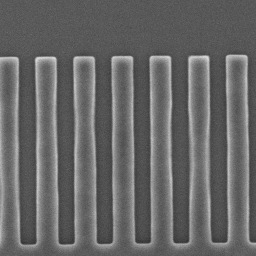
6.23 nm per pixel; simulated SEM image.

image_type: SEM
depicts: groups of lines, slits or small figures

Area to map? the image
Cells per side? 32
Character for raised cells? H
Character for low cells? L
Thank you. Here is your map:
LLLLLLLLLLLLLLLLLLLLLLLLLLLLLLLL
LLLLLLLLLLLLLLLLLLLLLLLLLLLLLLLL
LLLLLLLLLLLLLLLLLLLLLLLLLLLLLLLL
LLLLLLLLLLLLLLLLLLLLLLLLLLLLLLLL
LLLLLLLLLLLLLLLLLLLLLLLLLLLLLLLL
LLLLLLLLLLLLLLLLLLLLLLLLLLLLLLLL
LLLLLLLLLLLLLLLLLLLLLLLLLLLLLLLL
HHLLLHHLLHHHLLHHHLLHHLLLHHLLHHHL
HHLLLHHLLHHHLLHHHLLHHLLLHHLLHHHL
HHLLLHHLLHHHLLHHHLLHHLLLHHLLHHHL
HHLLLHHLLHHHLLHHHLLHHLLLHHLLHHHL
HHLLLHHLLHHHLLHHHLLHHLLLHHLLHHHL
HHLLLHHLLHHHLLHHHLLHHLLLHHLLHHHL
HHLLLHHLLHHHLLHHHLLHHLLLHHLLHHHL
HHLLLHHLLHHHLLHHHLLHHLLLHHLLHHHL
HHLLLHHLLHHHLLHHHLLHHLLLHHLLHHHL
HHLLLHHLLHHHLLHHHLLHHLLLHHLLHHHL
HHLLLHHLLHHHLLHHHLLHHLLLHHLLHHHL
HHLLLHHLLHHHLLHHHLLHHLLLHHLLLHHL
HHLLLHHLLHHHLLHHHLLHHLLLHHLLLHHL
HHLLLHHLLHHHLLHHHLLHHLLLHHLLLHHL
HHLLLHHLLHHHLLHHHLLHHLLLHHLLLHHL
HHLLLHHLLHHHLLHHHLLHHLLLHHLLLHHL
HHLLLHHLLHHHLLHHHLLHHLLLHHLLLHHL
HHLLLHHLLHHHLLHHHLLHHLLLHHLLLHHL
HHLLLHHLLHHHLLHHHLLHHLLLHHLLLHHL
HHLLLHHLLHHHLLHHHLLHHLLLHHLLLHHL
HHLLLHHLLHHHLLHHHLLHHLLLHHLLLHHL
HHLLLHHLLHHHLLHHHLLHHLLLHHLLLHHL
HHLLLHHLLHHHLLHHHLLHHLLLHHLLLHHL
HHHLHHHHLHHHHLHHHHHHHHLHHHHHHHHH
HHHHHHHHHHHHHHHHHHHHHHHHHHHHHHHH